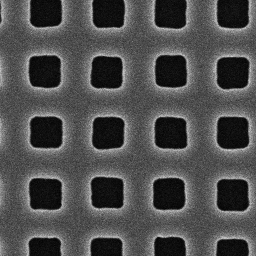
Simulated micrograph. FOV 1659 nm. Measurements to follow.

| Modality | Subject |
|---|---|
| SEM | a regular array of holes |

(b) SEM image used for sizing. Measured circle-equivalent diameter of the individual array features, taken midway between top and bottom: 227 nanometers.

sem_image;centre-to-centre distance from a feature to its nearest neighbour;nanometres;392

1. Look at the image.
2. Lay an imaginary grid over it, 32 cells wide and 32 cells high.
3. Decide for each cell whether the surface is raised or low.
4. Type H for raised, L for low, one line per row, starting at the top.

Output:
HHHHLLLLHHHHLLLLHHHLLLLHHHHLLLLH
HHHHLLLLHHHHLLLLHHHLLLLHHHHLLLLH
HHHHLLLLHHHHLLLLHHHLLLLHHHHLLLLH
HHHHHHHHHHHHHHHHHHHHLLLHHHHHLLHH
HHHHHHHHHHHHHHHHHHHHHHHHHHHHHHHH
HHHHHHHHHHHHHHHHHHHHHHHHHHHHHHHH
HHHHHHHHHHHHHHHHHHHHHHHHHHHHHHHH
HHHHLLLHHHHHLLLHHHHHLLLHHHHLLLLH
HHHHLLLLHHHLLLLHHHHLLLLHHHHLLLLH
HHHHLLLLHHHLLLLHHHHLLLLHHHHLLLLH
HHHHLLLHHHHLLLLHHHHHLLLHHHHLLLLH
HHHHHHHHHHHHHHHHHHHHHHHHHHHHHHHH
HHHHHHHHHHHHHHHHHHHHHHHHHHHHHHHH
HHHHHHHHHHHHHHHHHHHHHHHHHHHHHHHH
HHHHHHHHHHHHHHHHHHHHHHHHHHHHHHHH
HHHHLLLLHHHHLLLHHHHLLLLHHHHLLLLH
HHHHLLLLHHHLLLLHHHHLLLLHHHHLLLLH
HHHHLLLLHHHLLLLHHHHLLLLLHHHLLLLH
HHHHHLLHHHHHLLLHHHHHLLLHHHHHLLHH
HHHHHHHHHHHHHHHHHHHHHHHHHHHHHHHH
HHHHHHHHHHHHHHHHHHHHHHHHHHHHHHHH
HHHHHHHHHHHHHHHHHHHHHHHHHHHHHHHH
HHHHLLLHHHHHLLLHHHHHLLLHHHHHLLHH
HHHHLLLLHHHLLLLLHHHLLLLHHHHLLLLH
HHHHLLLLHHHLLLLLHHHLLLLHHHHLLLLH
HHHHLLLLHHHHLLLHHHHLLLLHHHHLLLLH
HHHHHHHHHHHHHHHHHHHHHHHHHHHHHHHH
HHHHHHHHHHHHHHHHHHHHHHHHHHHHHHHH
HHHHHHHHHHHHHHHHHHHHHHHHHHHHHHHH
HHHHHHHHHHHHHHHHHHHHHHHHHHHHHHHH
HHHHLLLLHHHLLLLHHHHLLLLHHHHLLLLH
HHHHLLLLHHHLLLLHHHHLLLLHHHHLLLLH